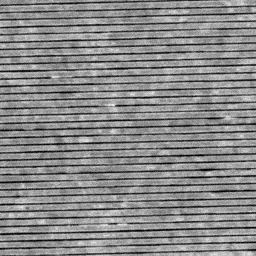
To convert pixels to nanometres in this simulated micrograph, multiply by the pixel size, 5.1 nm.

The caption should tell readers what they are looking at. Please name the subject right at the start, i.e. parallel lines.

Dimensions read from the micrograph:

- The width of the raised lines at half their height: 28 nm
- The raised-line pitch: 37.6 nanometres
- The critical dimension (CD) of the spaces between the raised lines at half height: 8.3 nanometers